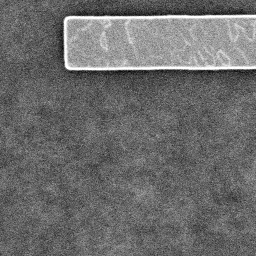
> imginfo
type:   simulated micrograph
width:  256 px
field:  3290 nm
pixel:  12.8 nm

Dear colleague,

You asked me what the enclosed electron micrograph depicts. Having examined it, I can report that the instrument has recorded wiring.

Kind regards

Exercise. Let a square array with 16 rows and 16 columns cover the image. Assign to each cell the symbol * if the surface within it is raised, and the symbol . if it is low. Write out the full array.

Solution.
................
....************
....************
....************
................
................
................
................
................
................
................
................
................
................
................
................